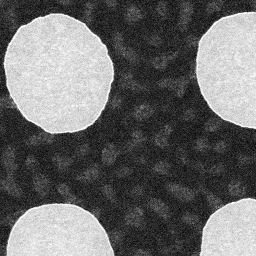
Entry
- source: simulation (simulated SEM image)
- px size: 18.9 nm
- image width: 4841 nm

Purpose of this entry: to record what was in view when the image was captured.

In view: raised bodies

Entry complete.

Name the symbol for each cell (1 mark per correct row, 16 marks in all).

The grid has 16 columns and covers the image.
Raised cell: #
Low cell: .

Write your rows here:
................
..###........###
.#####.......###
#######.....####
#######.....####
.######......###
.######......###
..####........##
................
................
................
................
...............#
.#####.......###
.######......###
#######......###